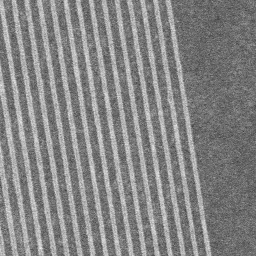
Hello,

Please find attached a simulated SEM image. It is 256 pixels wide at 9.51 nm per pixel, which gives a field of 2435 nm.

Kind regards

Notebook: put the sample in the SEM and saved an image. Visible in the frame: parallel lines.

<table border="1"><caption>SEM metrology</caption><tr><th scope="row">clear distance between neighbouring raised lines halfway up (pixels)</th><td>8.9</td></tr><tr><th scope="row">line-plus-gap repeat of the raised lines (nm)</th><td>121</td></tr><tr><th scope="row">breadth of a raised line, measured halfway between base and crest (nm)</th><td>36.4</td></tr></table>